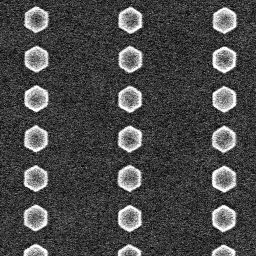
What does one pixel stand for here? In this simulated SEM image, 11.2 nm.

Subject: a regular array of raised bodies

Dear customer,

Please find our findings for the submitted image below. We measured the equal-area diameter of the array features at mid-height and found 0.263 um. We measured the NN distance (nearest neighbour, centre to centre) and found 440 nm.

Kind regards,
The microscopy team